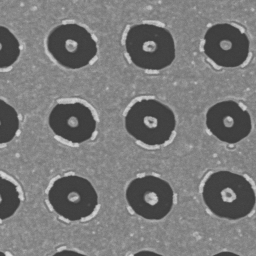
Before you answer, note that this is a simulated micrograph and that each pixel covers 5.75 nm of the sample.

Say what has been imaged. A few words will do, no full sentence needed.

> a regular array of ring-shaped grooves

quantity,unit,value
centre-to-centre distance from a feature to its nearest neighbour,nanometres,433